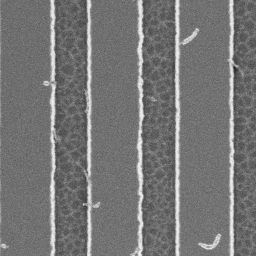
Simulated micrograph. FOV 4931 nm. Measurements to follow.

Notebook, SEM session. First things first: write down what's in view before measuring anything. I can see one or a few lines or trenches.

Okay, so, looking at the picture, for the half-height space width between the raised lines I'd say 689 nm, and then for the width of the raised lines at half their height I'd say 1040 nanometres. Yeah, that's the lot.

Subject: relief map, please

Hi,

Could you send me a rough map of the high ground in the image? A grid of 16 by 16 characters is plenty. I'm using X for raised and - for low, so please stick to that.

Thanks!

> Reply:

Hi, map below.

XXX---XXX--XXXX-
XXX---XXX--XXXX-
XXX---XXX--XXXX-
XXX---XXX--XXXX-
XXX---XXX--XXXX-
XXX---XXX--XXXX-
XXX--XXXX--XXXX-
XXX---XXX--XXXX-
XXX---XXX--XXXX-
XXX---XXX--XXXX-
XXX---XXX--XXXX-
XXX---XXX--XXX--
XXX---XXX--XXXX-
XXX---XXX--XXXX-
XXX---XXX--XXXX-
XXX---XXX--XXXX-